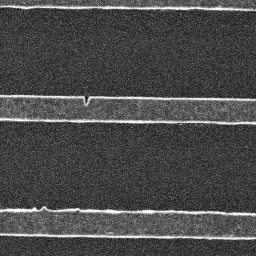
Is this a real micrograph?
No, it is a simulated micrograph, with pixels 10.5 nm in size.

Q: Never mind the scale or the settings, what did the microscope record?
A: one or a few lines or trenches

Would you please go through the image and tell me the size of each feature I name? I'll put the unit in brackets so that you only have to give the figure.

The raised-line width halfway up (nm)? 257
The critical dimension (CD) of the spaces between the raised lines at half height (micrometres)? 0.93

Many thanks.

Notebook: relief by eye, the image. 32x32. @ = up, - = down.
@@@@@@@@@@@@@@@@@@@@@@@@@@@@@@@@
--------------------------------
--------------------------------
--------------------------------
--------------------------------
--------------------------------
--------------------------------
--------------------------------
--------------------------------
--------------------------------
--------------------------------
--------------------------------
@@@@@@@@@@@@@@@@@@@@@@@@@@@@@@@@
@@@@@@@@@@@@@@@@@@@@@@@@@@@@@@@@
@@@@@@@@@@@@@@@@@@@@@@@@@@@@@@@@
--------------------------------
--------------------------------
--------------------------------
--------------------------------
--------------------------------
--------------------------------
--------------------------------
--------------------------------
--------------------------------
--------------------------------
--------------------------------
@@@@@@@@@@@@@@@@@-@@@@@@--@-----
@@@@@@@@@@@@@@@@@@@@@@@@@@@@@@@@
@@@@@@@@@@@@@@@@@@@@@@@@@@@@@@@@
------@-@----@@@@@@@@@@@@@@@@@@@
--------------------------------
--------------------------------